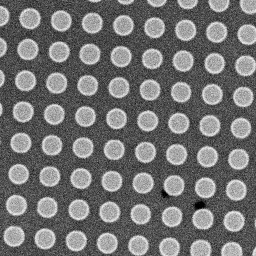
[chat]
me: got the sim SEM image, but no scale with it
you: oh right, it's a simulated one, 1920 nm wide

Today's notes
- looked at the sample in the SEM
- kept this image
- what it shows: an array of small figures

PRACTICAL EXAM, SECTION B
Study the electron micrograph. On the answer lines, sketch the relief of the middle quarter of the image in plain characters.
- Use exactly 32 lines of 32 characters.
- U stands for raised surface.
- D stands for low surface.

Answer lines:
DDDDDDDDDDDDDUUDDDDDUUUUDDDDUUUU
DDDDDDDDDDDDDDDDDDDDDDDDDDDDDUUD
DDDDDDDDDDDDDDDDDDDDDDDDDDDDDDDD
DDDDUUUDDDDDDDDDDDDDDDDDDDDDDDDD
UDDDUUUUDDDDUUUUDDDDUUUDDDDDDDDD
UDDDUUUUDDDUUUUUDDDUUUUUDDDUUUUD
DDDDUUUUDDDUUUUUDDDUUUUUDDDUUUUU
DDDDDUUDDDDDUUUDDDDUUUUUDDDUUUUU
DDDDDDDDDDDDDDDDDDDDUUUDDDDUUUUD
DDDDDDDDDDDDDDDDDDDDDDDDDDDDDDDD
DDDDDDDDDDDDDDDDDDDDDDDDDDDDDDDD
DDDDUUUDDDDDUUDDDDDDDDDDDDDDDDDD
DDDUUUUUDDDUUUUDDDDUUUUDDDDDUDDD
DDDUUUUUDDDUUUUDDDDUUUUDDDDUUUUD
DDDUUUUDDDDUUUUDDDDUUUUDDDUUUUUD
DDDDDDDDDDDDUUUDDDDUUUUDDDUUUUUD
DDDDDDDDDDDDDDDDDDDDUUDDDDDUUUUD
DDDDDDDDDDDDDDDDDDDDDDDDDDDDDDDD
DDDDDDDDDDDDDDDDDDDDDDDDDDDDDDDD
DDDUUUUDDDDUUUDDDDDDDDDDDDDDDDDD
DDUUUUUDDDUUUUUDDDDUUUDDDDDUUDDD
DDUUUUUDDDUUUUUDDDUUUUUDDDUUUUDD
DDDUUUUDDDUUUUUDDDUUUUUDDDUUUUUD
DDDDDDDDDDDUUUDDDDUUUUDDDDUUUUDD
DDDDDDDDDDDDDDDDDDDDDDDDDDDUUUDD
DDDDDDDDDDDDDDDDDDDDDDDDDDDDDDDD
DDDUUDDDDDDDDDDDDDDDDDDDDDDDDDDD
DDUUUUDDDDUUUUDDDDDUUDDDDDDDDDDD
DDUUUUUDDDUUUUDDDDUUUUDDDDUUUDDD
DDUUUUDDDDUUUUDDDUUUUUDDDUUUUUDD
DDDUUUDDDDUUUUDDDUUUUUDDDUUUUUDD
DDDDDDDDDDDUUDDDDDUUUUDDDUUUUUDD